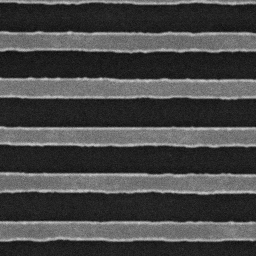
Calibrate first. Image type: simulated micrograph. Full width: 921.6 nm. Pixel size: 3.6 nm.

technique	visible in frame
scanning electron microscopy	lines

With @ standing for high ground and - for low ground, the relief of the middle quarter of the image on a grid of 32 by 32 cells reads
--------------------------------
--------------------------------
--------------------------------
---@-@---@@---------------------
@@@@@@@@@@@@@@@@@@@@@@@@@@@@@@@@
@@@@@@@@@@@@@@@@@@@@@@@@@@@@@@@@
@@@@@@@@@@@@@@@@@@@@@@@@@@@@@@@@
@@@@@@@@@@@@@@@@@@@@@@@@@@@@@@@@
--------------------------------
--------------------------------
--------------------------------
--------------------------------
--------------------------------
--------------------------------
--------------------------------
--------------------------------
@@@@@@@@@@@@@@@@@@@@@@@@@@@@@@@@
@@@@@@@@@@@@@@@@@@@@@@@@@@@@@@@@
@@@@@@@@@@@@@@@@@@@@@@@@@@@@@@@@
@@@@@@@@@@@@@@@@@@@@@@@@@@@@@@@@
------------------------------@@
--------------------------------
--------------------------------
--------------------------------
--------------------------------
--------------------------------
--------------------------------
@@@@@@@@@@@@@@@@@@@@@----@@-----
@@@@@@@@@@@@@@@@@@@@@@@@@@@@@@@@
@@@@@@@@@@@@@@@@@@@@@@@@@@@@@@@@
@@@@@@@@@@@@@@@@@@@@@@@@@@@@@@@@
@@@@@@@@@@@@@@@@@@@@@@@@@@@@@@@@